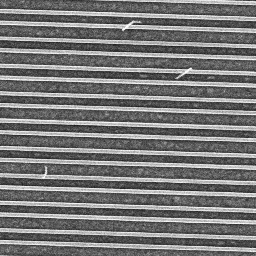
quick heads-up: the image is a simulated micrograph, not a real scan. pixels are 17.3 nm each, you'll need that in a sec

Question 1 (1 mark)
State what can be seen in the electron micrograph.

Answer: parallel lines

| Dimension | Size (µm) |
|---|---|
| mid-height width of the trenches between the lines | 0.156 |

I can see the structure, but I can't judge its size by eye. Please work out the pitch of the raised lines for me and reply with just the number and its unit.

235 nanometers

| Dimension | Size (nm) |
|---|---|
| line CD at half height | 62.7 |